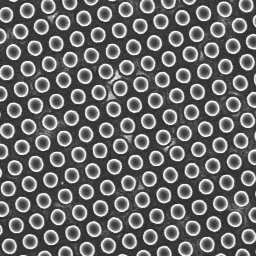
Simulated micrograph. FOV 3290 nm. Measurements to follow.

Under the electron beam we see a regular array of raised bodies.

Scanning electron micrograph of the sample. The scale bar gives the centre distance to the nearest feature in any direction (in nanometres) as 274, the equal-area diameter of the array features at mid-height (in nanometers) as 185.